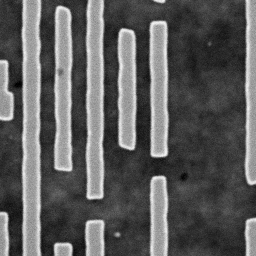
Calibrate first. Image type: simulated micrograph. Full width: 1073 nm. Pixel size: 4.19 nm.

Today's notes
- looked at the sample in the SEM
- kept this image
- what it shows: wiring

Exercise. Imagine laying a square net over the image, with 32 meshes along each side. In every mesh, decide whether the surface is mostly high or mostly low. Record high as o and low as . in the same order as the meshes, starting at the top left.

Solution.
...oo......oo..................o
...oo..oo..oo..................o
...oo..oo..oo..................o
...oo..oo..oo......oo..........o
...oo..oo..oo..oo..oo..........o
...oo..oo..oo..oo..oo..........o
...oo..oo..oo..oo..oo..........o
...oo..oo..oo..oo..oo..........o
o..oo..oo..oo..oo..oo..........o
o..oo..oo..oo..oo..oo..........o
o..oo..oo..oo..oo..oo..........o
o..oo..oo..oo..oo..oo..........o
oo.oo..oo..oo..oo..oo..........o
oo.oo..oo..oo..oo..oo..........o
o..oo..oo..oo..oo..oo..........o
...oo..oo..oo..oo..oo..........o
...oo..oo..oo..oo..oo..........o
...oo..oo..oo..oo..oo..........o
...oo..oo..oo...o..oo..........o
...oo..oo..oo......o...........o
...oo..oo..oo..................o
...oo......oo..................o
...oo......oo......oo..........o
...oo......oo......oo...........
...oo......oo......oo...........
...oo..............oo...........
...oo..............oo...........
o..oo..............oo..........o
o..oo......oo......oo..........o
o..oo......oo......oo..........o
o..oo..oo..oo......oo..........o
o..oo..oo..oo......oo..........o